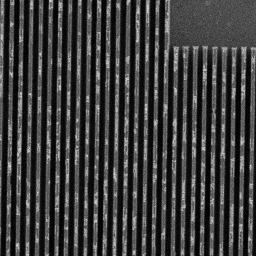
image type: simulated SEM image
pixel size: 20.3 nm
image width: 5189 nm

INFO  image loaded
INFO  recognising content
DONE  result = parallel lines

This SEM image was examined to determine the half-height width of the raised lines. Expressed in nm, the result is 96.2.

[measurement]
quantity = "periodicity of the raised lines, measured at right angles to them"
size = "0.196 microns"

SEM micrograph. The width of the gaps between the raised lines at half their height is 114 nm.